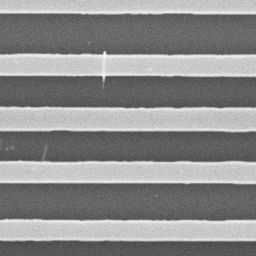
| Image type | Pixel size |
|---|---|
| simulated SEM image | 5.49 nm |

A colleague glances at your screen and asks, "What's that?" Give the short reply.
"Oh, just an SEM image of lines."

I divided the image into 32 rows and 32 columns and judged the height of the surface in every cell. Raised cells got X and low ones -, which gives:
XXXXXXXXXXXXXXXXXXXXXXXXXXXXXXXX
XXXXXXXXXXXXXXXXXXXXXXXXXXXXXXXX
--------------------------------
--------------------------------
--------------------------------
--------------------------------
--------------------------------
XXXXXXXXXXXXXXXXXXXXXXXXXXXXXXXX
XXXXXXXXXXXXXXXXXXXXXXXXXXXXXXXX
------------XX-----------XXXXXXX
--------------------------------
--------------------------------
--------------------------------
XXXXXXXXXXXXXXXX-X-XXX-XXXX-XXXX
XXXXXXXXXXXXXXXXXXXXXXXXXXXXXXXX
XXXXXXXXXXXXXXXXXXXXXXXXXXXXXXXX
--------------------------------
--------------------------------
--------------------------------
--------------------------------
XXXXXXXXXXXXXXXXXXXXXXXXXXXXXXXX
XXXXXXXXXXXXXXXXXXXXXXXXXXXXXXXX
XXXXXXXXXXXXXXXXXXXXXXXXXXXXXXXX
--------------------------------
--------------------------------
--------------------------------
--------------------------------
XX------------------------------
XXXXXXXXXXXXXXXXXXXXXXXXXXXXXXXX
XXXXXXXXXXXXXXXXXXXXXXXXXXXXXXXX
--------------------------------
--------------------------------